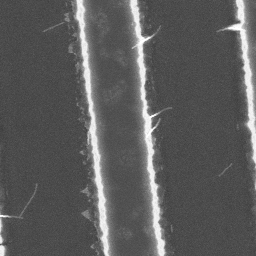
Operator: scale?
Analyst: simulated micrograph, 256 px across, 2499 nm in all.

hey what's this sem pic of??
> one or a few lines or trenches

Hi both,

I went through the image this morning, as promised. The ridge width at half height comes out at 55.7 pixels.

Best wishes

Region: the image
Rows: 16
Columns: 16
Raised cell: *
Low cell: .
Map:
.....***.......*
.....****......*
.....****......*
.....****......*
.....****......*
.....****.......
......***.......
......***.......
......***.......
......***.......
......***.......
......****......
......****......
......****......
......****......
.......***......